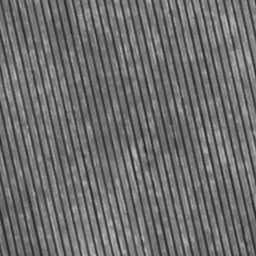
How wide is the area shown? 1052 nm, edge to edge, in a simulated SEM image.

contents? parallel lines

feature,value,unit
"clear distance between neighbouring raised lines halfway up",11.1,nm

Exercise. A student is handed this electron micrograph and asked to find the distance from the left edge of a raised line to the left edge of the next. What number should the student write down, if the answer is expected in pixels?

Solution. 7.76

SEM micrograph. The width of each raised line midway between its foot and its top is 22.5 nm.